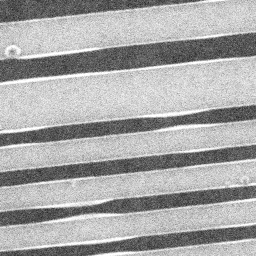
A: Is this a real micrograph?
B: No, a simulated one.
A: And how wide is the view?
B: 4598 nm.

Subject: groups of lines, slits or small figures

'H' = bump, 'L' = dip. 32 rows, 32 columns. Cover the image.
HHHHHHHHHHHHHHHHHHHHHHHLLLLLLLLL
HHHHHHHHHHHHHHLLLLLLLLLLLLLLLLLL
HHHHLLLLLLLLLLLLLLLLLLLLLLLLLLLL
LLLLLLLLLLLLLLLLLLLLLLLLLLLLLLLL
LLLLLLLLLLLLLLLLLLLLLLLLLLLHHHHH
LLLLLLLLLLLLLLLLLLHHHHHHHHHHHHHH
LHLLLLLLLHHHHHHHHHHHHHHHHHHHHHHH
HHHHHHHHHHHHHHHHHHHHHHHHHHHLLLLL
HHHHHHHHHHHHHHHHHHHLLLLLLLLLLLLL
HHHHHHHHHLLLLLLLLLLLLLLLLLLLLLLL
LLLLLLLLLLLLLLLLLLLLLLLLLLLLLLLL
LLLLLLLLLLLLLLLLLLLLLLLLLLLLLLLL
LLLLLLLLLLLLLLLLLLLLLLLLLLLLLLLL
LLLLLLLLLLLLLLLLLLLLLLLLLLLHHHHH
LLLLLLLLLLLLLLLLLLLHHHHHHHHHHHHH
LLLLLLLLLHHHHHHHHHHHHHHHHHHHLLLL
HHHHHHHHHHHHHHHHHHLLLLLLLLLLLLLL
HHHHHHHHHLLLLLLLLLLLLLLLLLLLLLLL
LLLLLLLLLLLLLLLLLLLLLLLLLLLHHHHH
LLLLLLLLLLLLLLLLLLHHHHHHHHHHHHHH
LLLLLLLLLHHHHHHHHHHHHHHHHHHHLLLL
HHHHHHHHHHHHHHHHHHLLLLLLLLLLLLLL
HHHHHHHHHLLLLLLLLLLLLLLLLLLLLLHL
LLLLLLLLLLLLLLLLLLLLLLLLLLLHHHHH
LLLLLLLLLLLLLLLLLLHHHHHHHHHHHHHH
LLLLLLLLLHHHHHHHHHHHHHHHHHHLLLLL
HHHHHHHHHHHHHHHHHHLLLLLLLLLLLLLL
HHHHHHHHLLLLLLLLLLLLLLLLLLLLLLLL
LLLLLLLLLLLLLLLLLLLLLLLLLLLHHHHH
LLLLLLLLLLLLLLLLLLHHHHHHHHHHHHHH
LLLLLLLLLHHHHHHHHHHHHHHHHHHLLLLL
HHHHHHHHHHHHHHHHHHLLLLLLLLLLLLLL